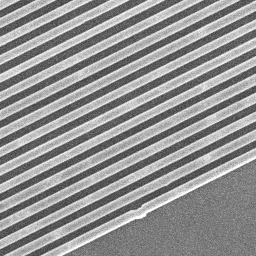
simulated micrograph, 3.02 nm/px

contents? parallel lines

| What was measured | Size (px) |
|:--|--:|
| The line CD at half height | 8.51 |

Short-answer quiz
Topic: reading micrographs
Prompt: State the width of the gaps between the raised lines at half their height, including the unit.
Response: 7.52 pixels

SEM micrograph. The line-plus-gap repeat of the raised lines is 16.5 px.